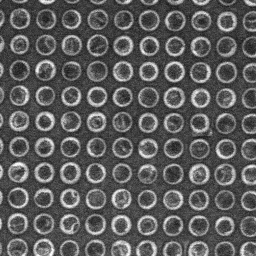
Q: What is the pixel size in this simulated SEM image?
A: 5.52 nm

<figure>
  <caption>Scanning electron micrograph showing a regular array of raised bodies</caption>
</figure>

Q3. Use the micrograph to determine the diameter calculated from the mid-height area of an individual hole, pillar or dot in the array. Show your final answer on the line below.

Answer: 106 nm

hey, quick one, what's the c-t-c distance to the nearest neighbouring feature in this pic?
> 140 nm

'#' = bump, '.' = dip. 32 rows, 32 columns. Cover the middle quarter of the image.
####..####...####..####...####..
####..#####.#####..####..#####..
####..#####.#####..####..#####..
###....###...###....###...###...
................................
................................
###....###...###....###...###...
####..####..#####..####..#####..
####..####..#####..#####.#####..
####..####...####..####..#####..
.......##.....#.....##....###...
................................
###....##....###....##.....#....
####..####...####..####..####...
####..####..#####..####..#####..
####..####..#####..####..#####..
.##....##....###...###....###...
................................
.#..............................
####..####...####..####...###...
####..####..#####..####..#####..
####..####..#####..####..####...
###....###...###...####...###...
................................
................................
###...###....###....##....###...
####..####...####..####..####...
####..####..#####..####..#####..
####..####...###...####..####...
.#.....##.....#.....##....###...
................................
.......##.....#.................